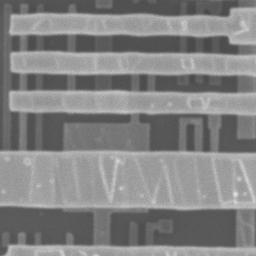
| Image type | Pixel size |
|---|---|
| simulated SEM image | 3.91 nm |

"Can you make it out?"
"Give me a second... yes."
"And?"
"wiring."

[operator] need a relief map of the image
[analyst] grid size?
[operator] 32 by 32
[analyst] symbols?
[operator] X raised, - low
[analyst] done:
--------------------------------
-----------------------------XXX
-XXXXXXXXXXXXXXXXXXXXXXXXXXXXXXX
-XXXXXXXXXXXXXXXXXXXXXXXXXXXXXXX
------------------------XX--XXXX
--------------------------------
---XXXXX------------------------
-XXXXXXXXXXXXXXXXXXXXXXXXXXXXXXX
-XXXXXXXXXXXXXXXXXXXXXXXXXXXXXXX
--------------------------------
--------------------------------
-XXXXXXXXXXXXXXXX---------------
-XXXXXXXXXXXXXXXXXXXXXXXXXXXXXXX
-XXXXXXXXXXXXXXXXXXXXXXXXXXXXXXX
--------------------------------
--------------------------------
--------------------------------
--------------------------------
--------------------------------
XXXXXXXXXXXXXXXXXXXXXXXXXXXXXXXX
XXXXXXXXXXXXXXXXXXXXXXXXXXXXXXXX
XXXXXXXXXXXXXXXXXXXXXXXXXXXXXXXX
XXXXXXXXXXXXXXXXXXXXXXXXXXXXXXXX
XXXXXXXXXXXXXXXXXXXXXXXXXXXXXXXX
XXXXXXXXXXXXXXXXXXXXXXXXXXXXXXXX
XXXXXXXXXXXXXXXXXXXXXXXXXXXXXXXX
--------------------------------
--------------------------------
--------------------------------
--------------------------------
--------------------------------
-XXXXXXXXXXXXXXXXXXXXXXXXXXXXXXX